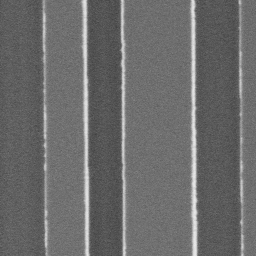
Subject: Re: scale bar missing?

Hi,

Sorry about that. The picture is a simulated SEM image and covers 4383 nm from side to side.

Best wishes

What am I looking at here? lines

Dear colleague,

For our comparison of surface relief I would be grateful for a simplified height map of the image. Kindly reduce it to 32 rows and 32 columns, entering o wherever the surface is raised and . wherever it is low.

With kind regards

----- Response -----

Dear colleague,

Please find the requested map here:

.....oooooo....ooooooooo......oo
.....oooooo....ooooooooo......oo
.....oooooo....ooooooooo......oo
.....oooooo....ooooooooo......oo
.....oooooo....ooooooooo......oo
.....oooooo....ooooooooo......oo
.....oooooo....ooooooooo......oo
......ooooo....ooooooooo......oo
......ooooo....ooooooooo......oo
......ooooo....ooooooooo......oo
......ooooo....ooooooooo......oo
.....oooooo....ooooooooo......oo
......ooooo....ooooooooo......oo
......ooooo....ooooooooo......oo
......ooooo....ooooooooo......oo
......ooooo....ooooooooo......oo
......ooooo....ooooooooo......oo
......ooooo....ooooooooo......oo
......ooooo....ooooooooo......oo
......ooooo....ooooooooo......oo
......ooooo....ooooooooo......oo
......ooooo....ooooooooo......oo
......ooooo....ooooooooo......oo
......ooooo....ooooooooo......oo
......ooooo....ooooooooo......oo
......ooooo....ooooooooo......oo
......ooooo....ooooooooo......oo
......ooooo....ooooooooo......oo
......ooooo....ooooooooo......oo
......ooooo....ooooooooo......oo
......ooooo....ooooooooo......oo
......ooooo....ooooooooo......oo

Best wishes